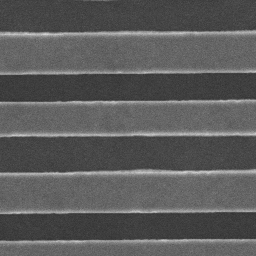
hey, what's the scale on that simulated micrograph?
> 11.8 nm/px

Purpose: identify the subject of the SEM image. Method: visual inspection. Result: lines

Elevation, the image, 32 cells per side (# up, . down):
................................
................................
................................
................................
################################
################################
################################
################################
################################
................................
................................
................................
................................
################################
################################
################################
################################
................................
................................
................................
................................
................................
################################
################################
################################
################################
#####################...........
................................
................................
................................
################################
################################